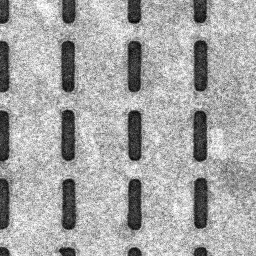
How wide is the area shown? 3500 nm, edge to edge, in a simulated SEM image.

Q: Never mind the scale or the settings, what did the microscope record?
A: a regular array of holes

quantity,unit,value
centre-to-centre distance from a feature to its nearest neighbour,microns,0.905